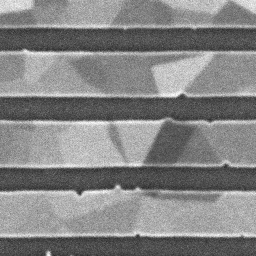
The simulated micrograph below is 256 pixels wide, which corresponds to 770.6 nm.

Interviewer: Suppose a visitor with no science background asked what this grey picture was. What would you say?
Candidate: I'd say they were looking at one or a few lines or trenches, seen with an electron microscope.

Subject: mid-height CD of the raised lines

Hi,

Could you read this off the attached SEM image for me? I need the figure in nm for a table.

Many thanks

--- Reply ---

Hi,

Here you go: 136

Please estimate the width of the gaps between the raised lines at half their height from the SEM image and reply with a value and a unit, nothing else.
74.2 nm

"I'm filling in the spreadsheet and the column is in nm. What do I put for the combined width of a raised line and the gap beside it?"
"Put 210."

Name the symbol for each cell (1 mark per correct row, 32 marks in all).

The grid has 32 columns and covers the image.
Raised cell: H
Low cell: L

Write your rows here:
HHHHHHHHHHHHHHHHHHHHHHHHHHHHHHHH
HHHHHHHHHHHHHHHHHHHHHHHHHHHHHHHH
HHHHHHHHHHHHHHHHHHHHHHHHHHHHHHHH
LLLLLLLLLLLLLLLLLLLLLLLLLLLLLLLL
LLLLLLLLLLLLLLLLLLLLLLLLLLLLLLLL
LLLLLLLLLLLLLLLLLLLLLLLLLLLLLLLL
LLHHLLLLLLLLLLLLLLLLLLLLLLLLLLLL
HHHHHHHHHHHHHHHHHHHHHHHHHHHHHHHH
HHHHHHHHHHHHHHHHHHHHHHHHHHHHHHHH
HHHHHHHHHHHHHHHHHHHHHHHHHHHHHHHH
HHHHHHHHHHHHHHHHHHHHHHHHHHHHHHHH
HHHHHHHHHHHHHHHHHHHHHHHHHHHHHHHH
LLLLLLLLLLLLLLLLLLLLLLLLLLLLLLLL
LLLLLLLLLLLLLLLLLLLLLLLLLLLLLLLL
LLLLLLLLLLLLLLLLLLLLLLLLLLLLLLLL
HHHHHHHHHHHHHHHHHHHHHHHHHHHHHHHH
HHHHHHHHHHHHHHHHHHHHHHHHHHHHHHHH
HHHHHHHHHHHHHHHHHHHHHHHHHHHHHHHH
HHHHHHHHHHHHHHHHHHHHHHHHHHHHHHHH
HHHHHHHHHHHHHHHHHHHHHHHHHHHHHHHH
HHHHHHHHHHHHHHHHHHHHHHHHHHHHHHHH
LLLLLLLLLLLLLLLLLLLLLLLLLLLLLLLL
LLLLLLLLLLLLLLLLLLLLLLLLLLLLLLLL
LLLLLLLLLLLLLLHLLLLLLLLLLLLLLLLL
HHHHHHHHHHHHHHHHHHHHHHHHHHHHHHHH
HHHHHHHHHHHHHHHHHHHHHHHHHHHHHHHH
HHHHHHHHHHHHHHHHHHHHHHHHHHHHHHHH
HHHHHHHHHHHHHHHHHHHHHHHHHHHHHHHH
HHHHHHHHHHHHHHHHHHHHHHHHHHHHHHHH
LHLLLLLLLLLLLLLLLLLLLLLLLLLLLLLL
LLLLLLLLLLLLLLLLLLLLLLLLLLLLLLLL
LLLLLLLLLLLLLLLLLLLLLLLLLLLLLLLL